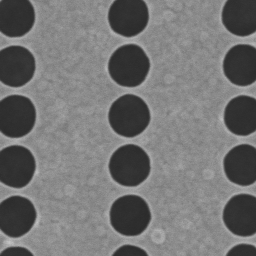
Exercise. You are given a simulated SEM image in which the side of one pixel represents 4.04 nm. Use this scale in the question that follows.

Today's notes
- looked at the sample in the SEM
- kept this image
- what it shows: holes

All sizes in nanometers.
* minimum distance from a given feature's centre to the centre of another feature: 200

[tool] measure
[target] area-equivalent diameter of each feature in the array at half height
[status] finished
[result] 170 nanometres